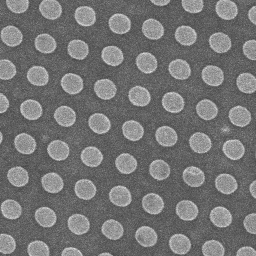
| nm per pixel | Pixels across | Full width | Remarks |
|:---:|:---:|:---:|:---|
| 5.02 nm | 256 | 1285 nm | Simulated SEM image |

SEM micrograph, a regular array of raised bodies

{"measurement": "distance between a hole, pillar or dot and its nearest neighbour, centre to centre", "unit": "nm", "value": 168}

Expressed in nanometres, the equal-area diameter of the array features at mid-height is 104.